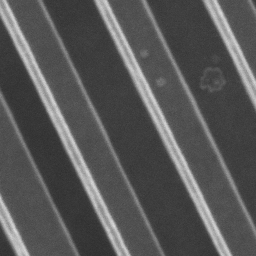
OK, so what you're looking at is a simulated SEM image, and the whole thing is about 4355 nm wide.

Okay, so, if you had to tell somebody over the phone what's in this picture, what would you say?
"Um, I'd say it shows lines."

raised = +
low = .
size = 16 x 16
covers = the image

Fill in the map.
+++...+++....+++
+++....+++....++
.+++...+++....++
.+++....+++...++
..+++...+++....+
..+++....+++...+
...+++...+++....
+..+++....+++...
+...+++...+++...
++..+++....+++..
++...+++...+++..
+++..+++....+++.
+++...+++...+++.
++++..+++....++.
++++...+++...+++
.++++..+++....++